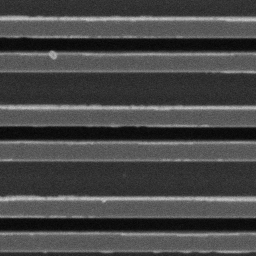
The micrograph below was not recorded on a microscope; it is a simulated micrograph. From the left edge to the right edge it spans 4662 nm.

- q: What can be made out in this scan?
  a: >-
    lines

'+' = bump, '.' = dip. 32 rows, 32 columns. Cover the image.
................................
................................
++++++++++++++++++++++++++++++++
++++++++++++++++++++++++++++++++
++++++++++++++++++++++++++++++++
................................
......+.........................
++++++++++++++++++++++++++++++++
++++++++++++++++++++++++++++++++
................................
................................
................................
................................
++++++++++++++++++++.+++++++++++
++++++++++++++++++++++++++++++++
++++++++++++++++++++++++++++++++
................................
................................
++++++++++++++++++++++++++++++++
++++++++++++++++++++++++++++++++
................................
................................
................................
................................
................................
++++++++++++++++++++++++++++++++
++++++++++++++++++++++++++++++++
................................
................................
++++++++++++++++++++++++++++++++
++++++++++++++++++++++++++++++++
.....+......++.....+..++.+.+++++